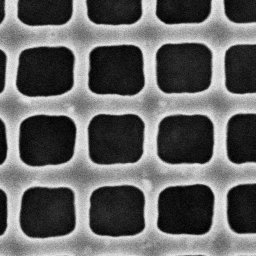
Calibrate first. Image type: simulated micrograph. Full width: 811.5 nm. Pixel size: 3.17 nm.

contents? a regular array of holes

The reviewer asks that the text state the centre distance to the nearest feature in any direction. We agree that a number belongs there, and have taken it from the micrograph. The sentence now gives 219 nm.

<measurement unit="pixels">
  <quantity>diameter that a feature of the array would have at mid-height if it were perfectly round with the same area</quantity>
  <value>57.7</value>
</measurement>